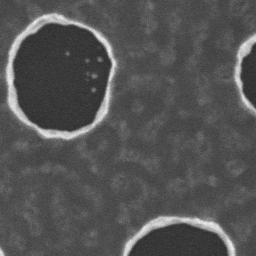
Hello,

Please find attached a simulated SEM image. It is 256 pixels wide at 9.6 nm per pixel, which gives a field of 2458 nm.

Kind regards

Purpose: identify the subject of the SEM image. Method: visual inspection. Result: holes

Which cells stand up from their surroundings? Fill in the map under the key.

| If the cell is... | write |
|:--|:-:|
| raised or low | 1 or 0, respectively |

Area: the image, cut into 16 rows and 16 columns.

1111111111111111
1110111111111111
1000001111111111
1000000111111110
1000000111111110
1000000111111110
1000001111111111
1100001111111111
1111111111111111
1111111111111111
1111111111111111
1111111111111111
1111111111111111
1111111111111111
1111111110000011
1111111100000011